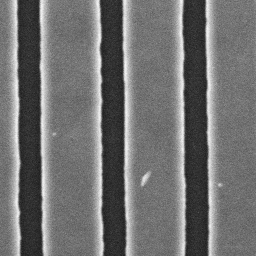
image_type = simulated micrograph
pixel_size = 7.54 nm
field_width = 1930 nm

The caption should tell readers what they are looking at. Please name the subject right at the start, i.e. lines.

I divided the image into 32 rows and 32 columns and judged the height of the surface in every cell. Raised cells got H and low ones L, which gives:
HHLLLHHHHHHHLLLHHHHHHHHLLLHHHHHH
HHLLLHHHHHHHLLLHHHHHHHHLLLHHHHHH
HHLLLHHHHHHHLLLHHHHHHHHLLLHHHHHH
HHLLLHHHHHHHHLLHHHHHHHHLLLHHHHHH
HHLLLHHHHHHHHLLHHHHHHHHLLLHHHHHH
HHLLLHHHHHHHLLLHHHHHHHHLLLHHHHHH
HHLLLHHHHHHHLLLHHHHHHHHLLLHHHHHH
HHLLLHHHHHHHHLLLHHHHHHHLLLHHHHHH
HHLLLHHHHHHHHLLLHHHHHHHLLLHHHHHH
HHLLLHHHHHHHHLLLHHHHHHHLLLHHHHHH
HHLLLHHHHHHHHLLLHHHHHHHLLLHHHHHH
HHLLLHHHHHHHHLLLHHHHHHHLLLHHHHHH
HHLLLHHHHHHHHLLLHHHHHHHLLLHHHHHH
HHLLLHHHHHHHHLLLHHHHHHHLLLHHHHHH
HHLLLHHHHHHHHLLLHHHHHHHLLLHHHHHH
HHLLLHHHHHHHHLLLHHHHHHHLLLHHHHHH
HHLLLHHHHHHHHLLLHHHHHHHLLLHHHHHH
HHLLLHHHHHHHHLLLHHHHHHHLLLHHHHHH
HHLLLHHHHHHHHLLLHHHHHHHLLLHHHHHH
HHLLLHHHHHHHHLLLHHHHHHHLLLHHHHHH
HHLLLHHHHHHHHLLLHHHHHHHLLLHHHHHH
HHLLLHHHHHHHHLLLHHHHHHHLLLHHHHHH
HHLLLHHHHHHHHLLLHHHHHHHLLLHHHHHH
HHLLLHHHHHHHHLLLHHHHHHHLLLHHHHHH
HHLLLHHHHHHHHLLLHHHHHHHLLLHHHHHH
HHLLLHHHHHHHHLLLHHHHHHHLLLHHHHHH
HHLLLHHHHHHHHLLLHHHHHHHLLLHHHHHH
HHLLLHHHHHHHHLLLHHHHHHHLLLHHHHHH
HHLLLHHHHHHHHLLLHHHHHHHLLLHHHHHH
HHHLLHHHHHHHHLLLHHHHHHHLLLHHHHHH
HHLLLHHHHHHHHLLLHHHHHHHLLLHHHHHH
HHLLLHHHHHHHHLLLHHHHHHHLLLHHHHHH